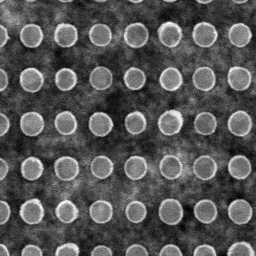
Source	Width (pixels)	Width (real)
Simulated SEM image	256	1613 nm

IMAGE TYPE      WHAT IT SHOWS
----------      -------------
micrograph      a regular array of raised bodies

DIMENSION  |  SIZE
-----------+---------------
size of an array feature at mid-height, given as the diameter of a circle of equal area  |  22.8 px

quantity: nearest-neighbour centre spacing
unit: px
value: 34.4